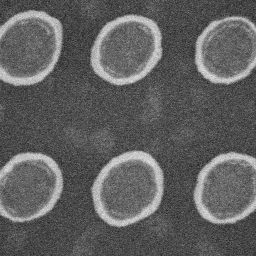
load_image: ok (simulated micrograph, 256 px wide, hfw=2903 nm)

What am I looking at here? raised bodies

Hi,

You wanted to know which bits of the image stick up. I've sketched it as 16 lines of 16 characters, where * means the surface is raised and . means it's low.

................
.**....**....***
****..****...***
****..****..****
***...***....**.
................
................
................
................
................
***....***...***
****..****..****
***...****..****
**.....**....**.
................
................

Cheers